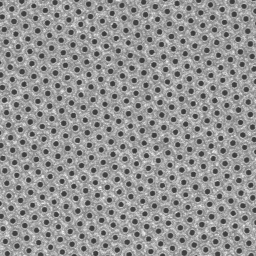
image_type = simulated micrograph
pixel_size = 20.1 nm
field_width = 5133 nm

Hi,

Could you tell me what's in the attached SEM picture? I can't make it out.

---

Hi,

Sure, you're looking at a regular array of holes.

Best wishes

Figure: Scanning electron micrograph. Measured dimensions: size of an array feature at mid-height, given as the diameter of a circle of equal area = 113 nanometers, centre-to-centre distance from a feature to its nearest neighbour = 249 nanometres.